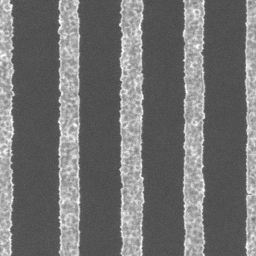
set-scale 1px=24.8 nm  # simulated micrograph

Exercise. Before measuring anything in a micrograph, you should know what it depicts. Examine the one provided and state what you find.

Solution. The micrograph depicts one or a few lines or trenches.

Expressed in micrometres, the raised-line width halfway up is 0.484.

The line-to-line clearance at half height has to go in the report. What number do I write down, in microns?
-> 1.08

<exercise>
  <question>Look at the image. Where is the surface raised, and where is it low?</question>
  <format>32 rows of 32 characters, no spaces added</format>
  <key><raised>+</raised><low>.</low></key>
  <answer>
+......+++.....+++.....++......+
+.......++.....+++.....++......+
++.....+++.....+++.....++......+
++.....+++.....+++.....++......+
+.......++.....+++.....++......+
++.....+++.....+++.....++......+
+......+++.....+++.....++......+
+.......++.....+++.....++......+
++.....+++.....+++.....++......+
++.....+++.....+++.....++......+
+......+++.....+++.....++......+
++......++.....+++.....++......+
+......+++.....+++.....++......+
+.......++.....+++.....++......+
+.......++.....+++.....++......+
++.....+++.....+++.....++......+
++......++.....+++.....++......+
+.......++.....+++.....++......+
+.......++.....+++.....++......+
+.......++.....+++.....++......+
+.......++.....+++.....++......+
+.......++.....+++.....++......+
+.......++.....+++.....++......+
++.....+++.....+++.....++......+
++......++.....+++.....++......+
+.......++.....+++.....++......+
+.......++.....+++.....++......+
+.......++.....+++.....++......+
+.......++.....+++.....++......+
+.......++.....+++.....++......+
+.......++.....+++.....++......+
+.......++.....+++.....++......+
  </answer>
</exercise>